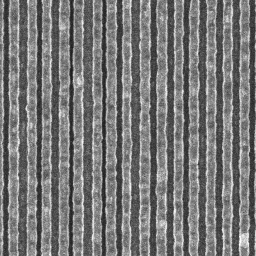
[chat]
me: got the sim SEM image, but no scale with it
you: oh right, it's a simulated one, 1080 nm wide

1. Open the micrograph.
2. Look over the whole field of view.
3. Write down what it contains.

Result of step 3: parallel lines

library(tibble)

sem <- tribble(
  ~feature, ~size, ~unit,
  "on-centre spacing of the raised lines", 16.5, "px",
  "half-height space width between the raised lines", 32.7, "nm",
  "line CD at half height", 36.4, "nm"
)